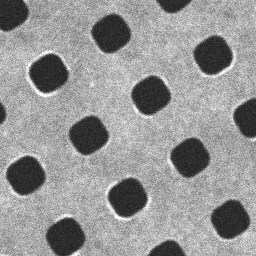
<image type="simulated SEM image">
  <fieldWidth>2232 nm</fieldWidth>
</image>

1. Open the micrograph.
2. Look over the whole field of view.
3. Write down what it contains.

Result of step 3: a regular array of holes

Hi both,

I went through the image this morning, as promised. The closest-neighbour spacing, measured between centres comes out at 642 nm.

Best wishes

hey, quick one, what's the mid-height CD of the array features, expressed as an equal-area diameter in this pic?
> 335 nm